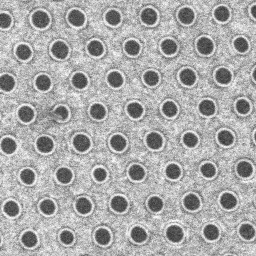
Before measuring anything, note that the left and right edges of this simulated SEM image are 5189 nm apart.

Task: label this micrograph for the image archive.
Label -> a regular array of raised bodies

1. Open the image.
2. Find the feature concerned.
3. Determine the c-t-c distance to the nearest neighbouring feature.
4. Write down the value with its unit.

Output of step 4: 720 nm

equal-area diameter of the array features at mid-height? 387 nanometers